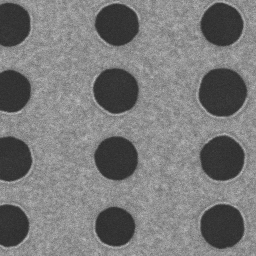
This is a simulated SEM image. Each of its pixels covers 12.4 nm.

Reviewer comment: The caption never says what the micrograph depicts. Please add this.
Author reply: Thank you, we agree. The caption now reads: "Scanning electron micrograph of a regular array of holes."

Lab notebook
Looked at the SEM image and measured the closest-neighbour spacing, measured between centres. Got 830 nm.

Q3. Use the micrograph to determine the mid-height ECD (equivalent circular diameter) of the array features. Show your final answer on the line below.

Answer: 552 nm